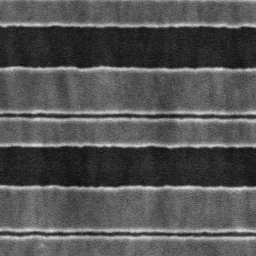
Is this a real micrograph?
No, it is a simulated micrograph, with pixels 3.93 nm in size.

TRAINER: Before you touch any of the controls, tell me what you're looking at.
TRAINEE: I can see lines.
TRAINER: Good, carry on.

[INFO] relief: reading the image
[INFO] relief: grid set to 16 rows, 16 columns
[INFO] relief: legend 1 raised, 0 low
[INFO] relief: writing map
1111111111111111
1111111111111111
0000000000000000
0000000000000000
1111111111111111
1111111111111111
1111111111111111
1111111111111111
1111111111111111
0000000000000000
0000000000000000
0000000000000000
1111111111111111
1111111111111111
1111111111111111
1111111111111111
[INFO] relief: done